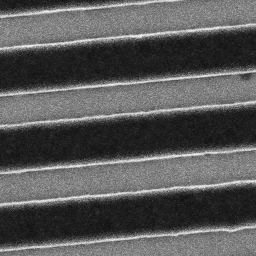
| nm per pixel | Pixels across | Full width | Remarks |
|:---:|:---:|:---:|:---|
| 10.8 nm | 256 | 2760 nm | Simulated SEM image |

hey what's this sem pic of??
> one or a few lines or trenches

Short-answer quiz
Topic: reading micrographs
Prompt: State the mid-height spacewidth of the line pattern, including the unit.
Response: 325 nm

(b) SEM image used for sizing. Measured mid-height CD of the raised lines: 0.508 micrometres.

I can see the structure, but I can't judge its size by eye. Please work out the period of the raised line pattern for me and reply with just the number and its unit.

836 nm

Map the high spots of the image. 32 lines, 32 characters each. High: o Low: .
ooooooooooooooooo...............
ooooooo.........................
................................
...........................ooooo
................oooooooooooooooo
......oooooooooooooooooooooooooo
oooooooooooooooooooooooooooooooo
oooooooooooooooooooooooooooooooo
oooooooooooooooooooooooooooooooo
oooooooooooooooooooooooooo......
oooooooooooooooo................
oooo............................
................................
........................oooooooo
.............ooooooooooooooooooo
...ooooooooooooooooooooooooooooo
oooooooooooooooooooooooooooooooo
oooooooooooooooooooooooooooooooo
oooooooooooooooooooooooooooooooo
oooooooooooooooooooooo..........
ooooooooooooo...................
oo..............................
................................
......................oooooooooo
...........ooooooooooooooooooooo
.ooooooooooooooooooooooooooooooo
oooooooooooooooooooooooooooooooo
oooooooooooooooooooooooooooooooo
ooooooooooooooooooooooooooooooo.
oooooooooooooooooooo............
oooooooooo......................
................................